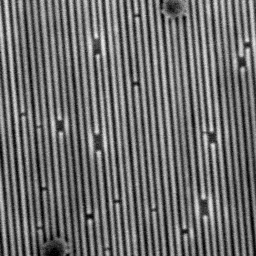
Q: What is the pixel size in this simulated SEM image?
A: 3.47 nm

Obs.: parallel lines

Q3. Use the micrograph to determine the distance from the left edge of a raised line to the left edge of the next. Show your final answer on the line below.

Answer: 24.9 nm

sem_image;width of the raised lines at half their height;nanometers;13.4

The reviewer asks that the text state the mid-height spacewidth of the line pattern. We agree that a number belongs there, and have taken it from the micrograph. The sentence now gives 10.4 nanometers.